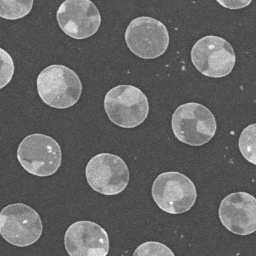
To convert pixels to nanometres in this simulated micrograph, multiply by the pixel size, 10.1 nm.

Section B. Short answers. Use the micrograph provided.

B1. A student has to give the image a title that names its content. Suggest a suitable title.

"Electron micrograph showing a regular array of raised bodies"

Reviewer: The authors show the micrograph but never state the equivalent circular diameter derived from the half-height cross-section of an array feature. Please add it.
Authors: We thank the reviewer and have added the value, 430 nm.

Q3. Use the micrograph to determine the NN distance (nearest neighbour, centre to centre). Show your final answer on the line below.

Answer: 698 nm